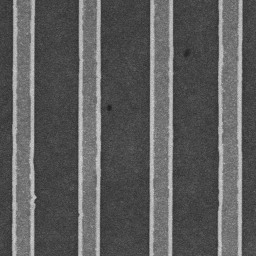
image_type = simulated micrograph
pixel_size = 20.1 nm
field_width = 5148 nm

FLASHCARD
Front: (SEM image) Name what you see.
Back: one or a few lines or trenches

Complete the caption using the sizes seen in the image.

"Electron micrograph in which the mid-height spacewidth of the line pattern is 993 nm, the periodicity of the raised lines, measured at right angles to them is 1.39 microns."